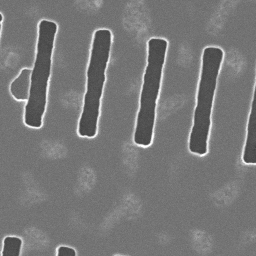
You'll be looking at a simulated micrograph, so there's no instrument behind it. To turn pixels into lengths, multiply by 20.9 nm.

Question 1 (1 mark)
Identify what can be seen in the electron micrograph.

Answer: holes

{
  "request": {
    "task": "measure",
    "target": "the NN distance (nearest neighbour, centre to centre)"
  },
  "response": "1.16 um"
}